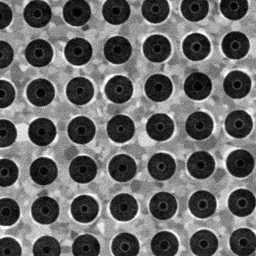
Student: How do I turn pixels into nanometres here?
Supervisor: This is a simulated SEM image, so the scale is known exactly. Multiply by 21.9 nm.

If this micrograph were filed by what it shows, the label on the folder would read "an array of small figures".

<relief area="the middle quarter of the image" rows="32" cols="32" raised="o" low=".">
oo...ooooooooooooooooooooooooooo
oooooooooooooooooooooooooooooooo
ooooooooooooo.ooooooooo..oooooo.
oo....ooooo.....ooooo.....oooo..
o......ooo.......ooo.......ooo..
........oo.......ooo.......ooo..
........oo........oo.......ooo..
........oo.......ooo.......ooo..
o.......oo.......oooo.....ooooo.
o......oooo.....ooooooo.oooooooo
oooooooooooooooooooooooooooooooo
oooooooooooooooooooooooooooooooo
oooooooooooooo.oooooooo...oooooo
oo....oooooo.....oooo......oooo.
o.......ooo......oooo.......oo..
o.......ooo.......oo........oo..
o.......ooo.......oo........oo..
o.......ooo.......ooo.......ooo.
o.......ooo......ooooo.....ooooo
oo.....ooooo....oooooooo.ooooooo
oooooooooooooooooooooooooooooooo
oooooooooooooooooooooooooooooooo
ooooooooooooo...ooooooo....ooooo
ooo....ooooo.....oooo.......ooo.
oo......ooo.......ooo.......ooo.
o.......ooo.......ooo.......oo..
o.......ooo.......ooo.......ooo.
o.......ooo.......ooo.......ooo.
oo......oooo.....ooooo.....ooooo
ooo....oooooo...oooooooooooooooo
oooooooooooooooooooooooooooooooo
oooooooooooooooooooooooooooooooo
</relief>